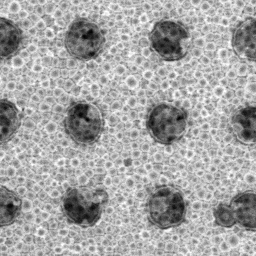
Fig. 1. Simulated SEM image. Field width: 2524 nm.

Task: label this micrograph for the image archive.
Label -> raised bodies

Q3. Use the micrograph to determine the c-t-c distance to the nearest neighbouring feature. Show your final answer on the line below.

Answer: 818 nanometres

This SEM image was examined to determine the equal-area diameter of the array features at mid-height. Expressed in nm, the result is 368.